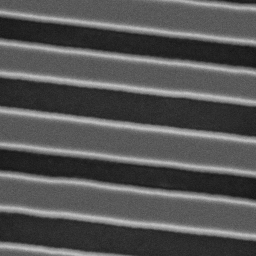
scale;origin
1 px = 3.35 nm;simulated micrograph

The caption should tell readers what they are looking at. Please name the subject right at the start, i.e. lines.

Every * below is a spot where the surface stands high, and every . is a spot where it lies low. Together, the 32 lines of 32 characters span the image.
****************************....
********************************
.....***************************
..............******************
......................**********
****...........................*
************....................
********************............
*****************************...
********************************
.........***********************
...................*************
............................****
................................
********........................
****************................
*************************.......
********************************
.*******************************
..........**********************
..................**************
............................****
********........................
*****************...............
***************************.....
********************************
...*****************************
...........*********************
....................************
.............................***
................................
*********.......................